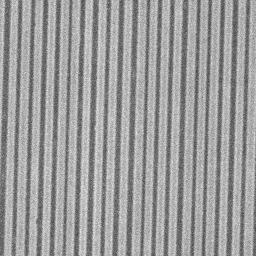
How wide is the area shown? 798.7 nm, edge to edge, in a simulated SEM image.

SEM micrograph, parallel lines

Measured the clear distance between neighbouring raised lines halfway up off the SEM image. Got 0.0156 µm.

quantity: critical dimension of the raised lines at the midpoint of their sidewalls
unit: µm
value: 0.0214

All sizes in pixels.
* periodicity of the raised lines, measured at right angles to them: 12.6